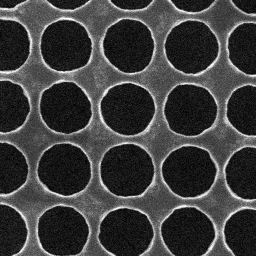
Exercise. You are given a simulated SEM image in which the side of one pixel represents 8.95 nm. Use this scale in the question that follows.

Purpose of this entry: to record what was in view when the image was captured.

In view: a regular array of holes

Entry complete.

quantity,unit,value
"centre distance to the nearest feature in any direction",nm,552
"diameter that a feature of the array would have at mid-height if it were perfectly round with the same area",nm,475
